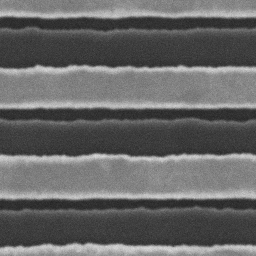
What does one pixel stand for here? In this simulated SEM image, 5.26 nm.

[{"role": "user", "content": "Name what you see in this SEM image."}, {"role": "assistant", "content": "lines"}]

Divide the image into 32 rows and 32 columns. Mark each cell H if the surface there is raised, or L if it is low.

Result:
HHHHHHHHHHHHHHHHHHHHHHHHHHHHHHHH
HHHHHHHHHHHHHHHHHHHHHHHHHHHHHHHH
LLLLLLLLLLLLLLLLLLLLLLLLLLLLLLLL
LLLLLLLLLLLLLLLLLLLLLLLLLLLLLLLL
LLLLLLLLLLLLLLLLLLLLLLLLLLLLLLLL
LLLLLLLLLLLLLLLLLLLLLLLLLLLLLLLL
LLLLLLLLLLLLLLLLLLLLLLLLLLLLLLLL
LLLLLLLLLLLLLLLLLLLLLLLLLLLLLLLL
LLLLHHHLLHHHHHLHHLLLLHHHHHLHHHHL
HHHHHHHHHHHHHHHHHHHHHHHHHHHHHHHH
HHHHHHHHHHHHHHHHHHHHHHHHHHHHHHHH
HHHHHHHHHHHHHHHHHHHHHHHHHHHHHHHH
HHHHHHHHHHHHHHHHHHHHHHHHHHHHHHHH
LLLLLLLLLLLLLLLLLLLLLLLLLLLLLLLL
LLLLLLLLLLLLLLLLLLLLLLLLLLLLLLLL
LLLLLLLLLLLLLLLLLLLLLLLLLLLLLLLL
LLLLLLLLLLLLLLLLLLLLLLLLLLLLLLLL
LLLLLLLLLLLLLLLLLLLLLLLLLLLLLLLL
LLLLLLLLLLLLLLLLLLLLLLLLLLLLLLLL
HLHLLLLHLLHHHHHHLLLLLHHHHHHHHHHH
HHHHHHHHHHHHHHHHHHHHHHHHHHHHHHHH
HHHHHHHHHHHHHHHHHHHHHHHHHHHHHHHH
HHHHHHHHHHHHHHHHHHHHHHHHHHHHHHHH
HHHHHHHHHHHHHHHHHHHHHHHHHHHHHHHH
HHHHHHHHHHHHHHHHHHHHHHHHHHHHHHHH
LLLLLLLLLLLLLLLLLLLLLLLLLLLLLLLL
LLLLLLLLLLLLLLLLLLLLLLLLLLLLLLLL
LLLLLLLLLLLLLLLLLLLLLLLLLLLLLLLL
LLLLLLLLLLLLLLLLLLLLLLLLLLLLLLLL
LLLLLLLLLLLLLLLLLLLLLLLLLLLLLLLL
LLLLLLLLLLLLLLLLLLLLLLLLLLLLLLLL
HHHHHHHHHHHHHHHHHHHHHHHHHHHHHHHH